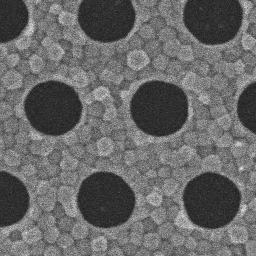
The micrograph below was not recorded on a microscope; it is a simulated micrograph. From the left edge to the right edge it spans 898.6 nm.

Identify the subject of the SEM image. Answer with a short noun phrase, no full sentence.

holes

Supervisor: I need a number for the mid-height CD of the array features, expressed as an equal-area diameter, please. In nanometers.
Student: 201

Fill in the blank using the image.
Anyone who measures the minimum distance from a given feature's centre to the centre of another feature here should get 371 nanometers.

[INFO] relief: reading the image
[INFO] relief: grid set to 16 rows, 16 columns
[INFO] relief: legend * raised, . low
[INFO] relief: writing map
..***...****...*
..***...****...*
.*****.*****..**
****************
****************
**..*****..****.
**...***....***.
**...***....***.
****************
****************
****************
.****...****...*
..***...***....*
..***...****...*
****************
****************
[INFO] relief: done